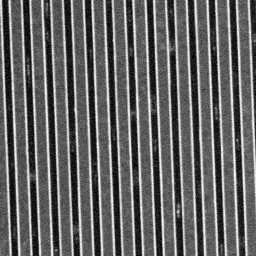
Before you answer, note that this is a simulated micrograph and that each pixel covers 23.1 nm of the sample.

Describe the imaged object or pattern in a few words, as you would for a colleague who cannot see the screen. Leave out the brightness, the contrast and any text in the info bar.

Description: parallel lines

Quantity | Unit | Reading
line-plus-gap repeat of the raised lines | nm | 477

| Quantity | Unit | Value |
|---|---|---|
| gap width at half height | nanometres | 196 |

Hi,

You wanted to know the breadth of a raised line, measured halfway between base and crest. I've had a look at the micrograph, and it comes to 286 nm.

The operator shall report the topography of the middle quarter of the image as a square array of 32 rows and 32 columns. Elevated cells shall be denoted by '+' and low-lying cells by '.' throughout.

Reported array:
...++...+++..+++..+++..+++..+++.
...++...+++..+++..+++..+++...++.
...++...+++..+++..+++..+++...++.
...+++..+++..+++..+++..+++...++.
...+++..+++..+++..+++..+++...++.
...+++..+++..+++..+++..+++...++.
...+++..+++..+++..+++..+++...++.
...+++..+++..+++..+++...++...++.
...+++..+++..+++..+++...++...++.
+..+++..+++..+++..+++...++...++.
+..+++..+++..+++..+++...+++..+++
+..+++..+++..+++..+++...+++..+++
+..+++..+++..+++..+++...+++..+++
+..+++..+++..+++...++...+++..+++
+..+++..+++..+++...++...+++..+++
+..+++..+++..+++...++...+++..+++
+..+++..+++..+++...+++..+++..+++
+..+++..+++..+++...+++..+++..+++
+..+++..+++..+++...+++..+++..+++
+..+++...++...++...+++..+++..+++
+..+++...++...++...+++..+++..+++
+..+++...++...++...+++..+++..+++
+..+++...++...++...+++..+++..+++
+..+++...+++..+++..+++..+++..+++
+..+++...+++..+++..+++..+++..+++
+...++...+++..+++..+++..+++..+++
+...++...+++..+++..+++..+++..+++
+...++...+++..+++..+++..+++..+++
+...++...+++..+++..+++..+++...++
+...+++..+++..+++..+++..+++...++
+...+++..+++..+++..+++..+++...++
+...+++..+++..+++..+++..+++...++